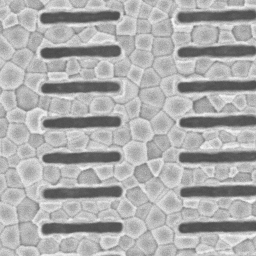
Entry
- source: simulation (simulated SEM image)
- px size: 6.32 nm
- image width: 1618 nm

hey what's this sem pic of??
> holes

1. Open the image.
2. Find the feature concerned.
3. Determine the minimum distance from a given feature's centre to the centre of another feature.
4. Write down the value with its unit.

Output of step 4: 0.221 micrometres